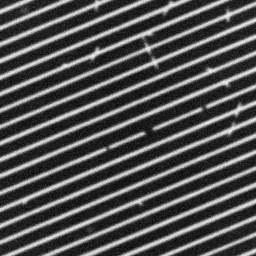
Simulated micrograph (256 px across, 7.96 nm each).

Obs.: parallel lines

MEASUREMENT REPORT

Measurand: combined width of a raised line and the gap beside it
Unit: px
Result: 15.2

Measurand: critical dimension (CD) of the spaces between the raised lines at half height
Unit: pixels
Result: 12.2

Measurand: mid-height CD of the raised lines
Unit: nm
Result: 22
